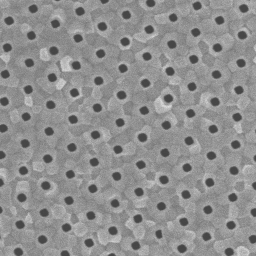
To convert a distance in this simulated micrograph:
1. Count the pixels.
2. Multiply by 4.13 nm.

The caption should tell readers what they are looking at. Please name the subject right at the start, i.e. a regular array of holes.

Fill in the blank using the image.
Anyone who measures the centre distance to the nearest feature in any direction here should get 110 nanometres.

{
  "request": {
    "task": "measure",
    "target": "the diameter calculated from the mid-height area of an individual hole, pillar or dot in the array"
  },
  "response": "0.0367 micrometres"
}